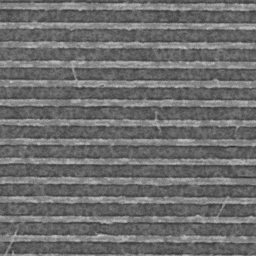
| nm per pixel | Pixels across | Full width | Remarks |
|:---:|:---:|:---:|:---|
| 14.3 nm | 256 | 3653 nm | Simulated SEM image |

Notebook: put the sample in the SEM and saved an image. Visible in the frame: parallel lines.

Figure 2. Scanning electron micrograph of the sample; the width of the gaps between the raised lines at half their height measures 189 nanometers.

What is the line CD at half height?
78.5 nanometers